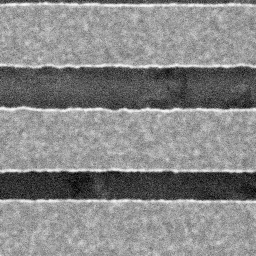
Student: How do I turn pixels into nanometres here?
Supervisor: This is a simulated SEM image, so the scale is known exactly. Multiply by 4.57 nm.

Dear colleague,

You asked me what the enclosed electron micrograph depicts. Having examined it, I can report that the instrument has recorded lines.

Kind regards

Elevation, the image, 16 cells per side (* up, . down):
****************
****************
****************
****************
................
................
................
****************
****************
****************
****************
................
................
****************
****************
****************